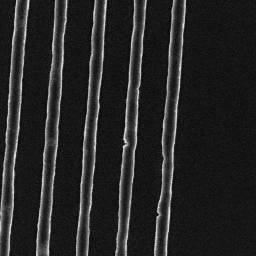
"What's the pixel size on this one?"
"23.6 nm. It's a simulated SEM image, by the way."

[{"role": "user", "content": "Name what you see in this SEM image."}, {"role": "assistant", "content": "parallel lines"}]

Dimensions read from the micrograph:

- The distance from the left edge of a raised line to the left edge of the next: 0.928 um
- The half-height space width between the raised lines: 651 nm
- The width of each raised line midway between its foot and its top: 283 nm